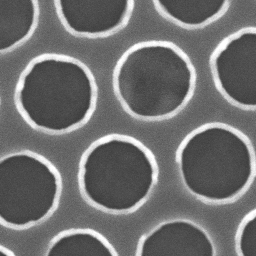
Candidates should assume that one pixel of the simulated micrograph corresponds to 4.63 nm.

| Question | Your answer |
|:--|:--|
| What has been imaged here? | holes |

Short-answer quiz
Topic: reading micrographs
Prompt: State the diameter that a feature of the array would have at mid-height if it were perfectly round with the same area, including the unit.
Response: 323 nanometers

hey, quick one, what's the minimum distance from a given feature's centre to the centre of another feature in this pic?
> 451 nm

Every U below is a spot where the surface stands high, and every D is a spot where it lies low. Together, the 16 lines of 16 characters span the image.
DDUUDDDDUUDDDDUU
DDUUDDDUUUUUUUUU
DUUUUUUUUUUUUUUD
UUUUUUUUUDDUUUDD
UUDDDUUUDDDDUUDD
UDDDDDUUDDDDUUDD
UDDDDDUUDDDUUUUD
UUDDDUUUUUUUUUUU
UUUUUUUUUUUUDDDU
UUUUUUDDDUUDDDDD
DDDUUDDDDUUDDDDD
DDDDUDDDDUUUDDDU
DDDUUUDDDUUUUUUU
DDDUUUUUUUUUUUUU
UUUUUUUUUUDDDUUD
UUUDDDDUUDDDDUUD